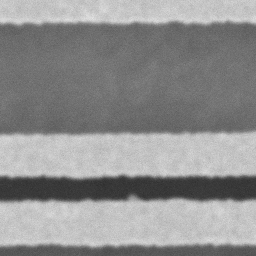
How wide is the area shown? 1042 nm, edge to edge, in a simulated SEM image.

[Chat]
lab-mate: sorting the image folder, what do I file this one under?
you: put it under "lines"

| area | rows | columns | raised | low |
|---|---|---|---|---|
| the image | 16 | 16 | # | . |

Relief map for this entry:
################
................
................
................
................
................
................
................
################
################
################
................
................
################
################
................